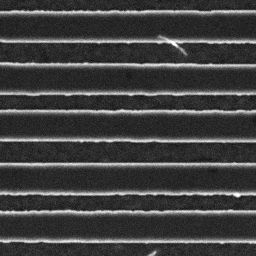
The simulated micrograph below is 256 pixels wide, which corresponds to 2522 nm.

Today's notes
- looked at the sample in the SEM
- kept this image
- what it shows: lines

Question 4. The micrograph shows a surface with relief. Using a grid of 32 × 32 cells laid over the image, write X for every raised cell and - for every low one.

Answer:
--------------------------------
-XXXXXXX-X--XXXXXXXXXXXXX-XXXXXX
XXXXXXXXXXXXXXXXXXXXXXXXXXXXXXXX
XXXXXXXXXXXXXXXXXXXXXXXXXXXXXXXX
XXXXXXXXXXXXXXXXXXXXXXXXXXXXXXXX
--------------------------------
--------------------------------
--------------------------------
XXXXXXXXXXXXXXXXXXXXXXXXXXXXXXXX
XXXXXXXXXXXXXXXXXXXXXXXXXXXXXXXX
XXXXXXXXXXXXXXXXXXXXXXXXXXXXXXXX
XXXXXXXXXXXXXXXXXXXXXXXXXXXXXXXX
--------------------------------
--------------------------------
XXXXXXXXXXXXXXXXXXXXXXXXXXXXXXXX
XXXXXXXXXXXXXXXXXXXXXXXXXXXXXXXX
XXXXXXXXXXXXXXXXXXXXXXXXXXXXXXXX
XXXXXXXXXXXXXXXXXXXXXXXXXXXXXXXX
--------------------------------
--------------------------------
XXXXXXXXXXXXXXXXXXXXXXXXXXXXXXXX
XXXXXXXXXXXXXXXXXXXXXXXXXXXXXXXX
XXXXXXXXXXXXXXXXXXXXXXXXXXXXXXXX
XXXXXXXXXXXXXXXXXXXXXXXXXXXXXXXX
--------------------------------
--------------------------------
XX-XXXXXXXXXXXXXXXXXXXXXXXXXXXXX
XXXXXXXXXXXXXXXXXXXXXXXXXXXXXXXX
XXXXXXXXXXXXXXXXXXXXXXXXXXXXXXXX
XXXXXXXXXXXXXXXXXXXXXXXXXXXXXXXX
--------------------------------
--------------------------------